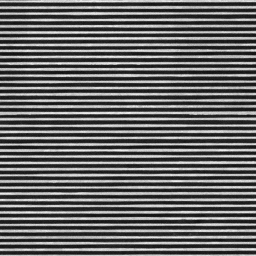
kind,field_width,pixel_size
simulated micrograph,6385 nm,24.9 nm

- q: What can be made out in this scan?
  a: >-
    parallel lines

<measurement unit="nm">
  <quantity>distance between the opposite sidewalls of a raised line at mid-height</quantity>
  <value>46.8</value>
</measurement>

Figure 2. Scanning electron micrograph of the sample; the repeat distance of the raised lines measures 6.21 pixels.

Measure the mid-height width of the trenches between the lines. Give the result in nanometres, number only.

93.5